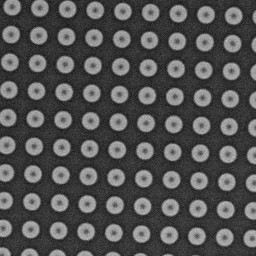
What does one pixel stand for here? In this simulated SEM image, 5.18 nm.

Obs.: an array of small figures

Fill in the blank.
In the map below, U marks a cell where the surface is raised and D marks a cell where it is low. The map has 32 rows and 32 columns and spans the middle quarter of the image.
UUDDDUUUUDDDUUUUDDDUUUUDDDUUUUDD
UUDDDUUUUDDDUUUUDDDUUUUDDDUUUUDD
DDDDDDDDDDDDDUUDDDDDUUUDDDUUUUDD
DDDDDDDDDDDDDDDDDDDDDDDDDDDDDDDD
DDDDDDDDDDDDDDDDDDDDDDDDDDDDDDDD
UDDDDDUUDDDDDDDDDDDDDDDDDDDDDDDD
UUDDDUUUUDDDUUUUDDDUUUDDDDUUUDDD
UUDDDUUUUDDDUUUUDDDUUUUDDDUUUUDD
UUDDDUUUUDDDUUUUDDDUUUUDDDUUUUDD
DDDDDDDDDDDDDUUDDDDUUUDDDDUUUDDD
DDDDDDDDDDDDDDDDDDDDDDDDDDDDDDDD
DDDDDDDDDDDDDDDDDDDDDDDDDDDDDDDD
UDDDDUUUDDDDDDDDDDDDDDDDDDDDDDDD
UUDDDUUUUDDDUUUDDDDUUUDDDDUUUDDD
UUDDDUUUUDDDUUUUDDUUUUUDDUUUUDDD
UDDDDUUUDDDDUUUDDDDUUUDDDUUUUDDD
DDDDDDDDDDDDDUDDDDDUUUDDDDUUUDDD
DDDDDDDDDDDDDDDDDDDDDDDDDDDDDDDD
DDDDDDDDDDDDDDDDDDDDDDDDDDDDDDDD
UDDDDUUUDDDDDUDDDDDDDDDDDDDDDDDD
UDDDUUUUDDDUUUUDDDDUUUDDDDUUUDDD
UDDDUUUUDDDUUUUDDDUUUUDDDUUUUDDD
UDDDDUUUDDDUUUUDDDUUUUDDDUUUUDDD
DDDDDDDDDDDDDDDDDDDUUDDDDDUUUDDD
DDDDDDDDDDDDDDDDDDDDDDDDDDDDDDDD
DDDDDDDDDDDDDDDDDDDDDDDDDDDDDDDD
UDDDDUUUDDDDUUDDDDDDDDDDDDDDDDDD
UDDDUUUUDDDUUUUDDDUUUUDDDUUUDDDD
UDDDUUUUDDDUUUUDDDUUUUDDDUUUUDDD
DDDDDUUUDDDUUUUDDDUUUUDDDUUUUDDD
DDDDDDDDDDDDDDDDDDDUUDDDDUUUDDDD
DDDDDDDDDDDDDDDDDDDDDDDDDDDDDDDD